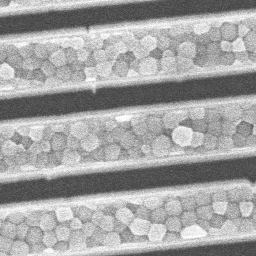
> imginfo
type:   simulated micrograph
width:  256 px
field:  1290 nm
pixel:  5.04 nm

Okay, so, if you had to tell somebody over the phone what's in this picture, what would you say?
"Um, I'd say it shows one or a few lines or trenches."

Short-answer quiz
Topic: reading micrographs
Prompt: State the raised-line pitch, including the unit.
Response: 422 nanometers